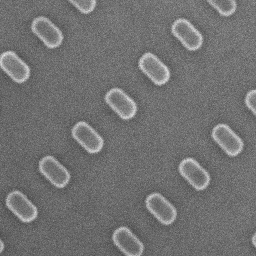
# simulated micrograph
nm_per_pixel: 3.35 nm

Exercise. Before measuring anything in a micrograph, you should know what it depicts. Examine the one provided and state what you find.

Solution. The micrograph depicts a regular array of raised bodies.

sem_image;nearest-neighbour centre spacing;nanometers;160